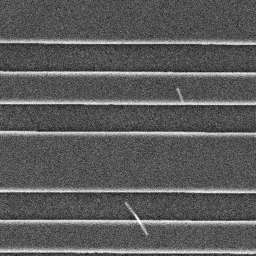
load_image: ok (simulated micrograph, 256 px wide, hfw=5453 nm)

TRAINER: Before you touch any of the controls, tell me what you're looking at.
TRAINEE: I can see lines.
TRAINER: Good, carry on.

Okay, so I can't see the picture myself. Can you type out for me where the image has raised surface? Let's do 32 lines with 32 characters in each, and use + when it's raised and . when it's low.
++++++++++++++++++++++++++++++++
++++++++++++++++++++++++++++++++
++++++++++++++++++++++++++++++++
++++++++++++++++++++++++++++++++
++++++++++++++++++++++++++++++++
.............................+++
................................
................................
................................
++++++++++++++++++++++++++++++++
++++++++++++++++++++++++++++++++
++++++++++++++++++++++++++++++++
++++++++++++++++++++++++++++++++
................................
................................
................................
++..............................
++++++++++++++++++++++++++++++++
++++++++++++++++++++++++++++++++
++++++++++++++++++++++++++++++++
++++++++++++++++++++++++++++++++
++++++++++++++++++++++++++++++++
++++++++++++++++++++++++++++++++
++++++++++++++++++++++++++++++++
................................
................................
................................
................................
++++++++++++++++++++++++++++++++
++++++++++++++++++++++++++++++++
++++++++++++++++++++++++++++++++
................++++++++++++++++